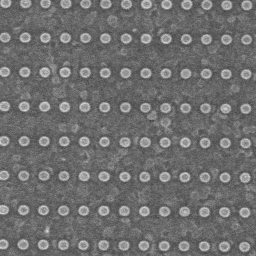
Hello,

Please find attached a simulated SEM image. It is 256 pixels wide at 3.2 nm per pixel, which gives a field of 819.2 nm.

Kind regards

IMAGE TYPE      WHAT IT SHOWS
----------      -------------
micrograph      a regular array of raised bodies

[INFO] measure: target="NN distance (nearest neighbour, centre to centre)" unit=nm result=63.9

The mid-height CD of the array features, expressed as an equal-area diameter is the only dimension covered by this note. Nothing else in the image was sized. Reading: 30.2 nanometers